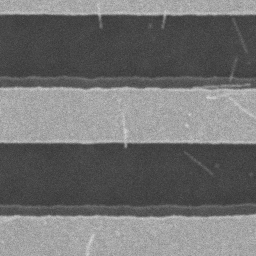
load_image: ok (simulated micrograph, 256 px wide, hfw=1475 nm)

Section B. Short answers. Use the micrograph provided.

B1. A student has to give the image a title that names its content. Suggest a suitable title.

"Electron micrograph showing lines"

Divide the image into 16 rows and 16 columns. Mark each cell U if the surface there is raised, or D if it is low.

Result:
UUUUUUUUUUUUUUUU
DDDDDDDDDDDDDDDD
DDDDDDDDDDDDDDDD
DDDDDDDDDDDDDDDD
DDDDDDDDDDDDDDDD
UUUUUUUUUUUUUUUU
UUUUUUUUUUUUUUUU
UUUUUUUUUUUUUUUU
UUUUUUUUUUUUUUUU
DDDDDDDDDDDDDDDD
DDDDDDDDDDDDDDDD
DDDDDDDDDDDDDDDD
DDDDDDDDDDDDDDDD
UUUUUUUUUUUUUUUU
UUUUUUUUUUUUUUUU
UUUUUUUUUUUUUUUU